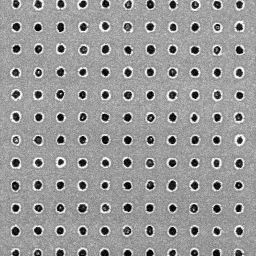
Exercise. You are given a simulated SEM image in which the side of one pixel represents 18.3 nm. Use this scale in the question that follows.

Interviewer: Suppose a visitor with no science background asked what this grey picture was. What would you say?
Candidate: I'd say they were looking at a regular array of holes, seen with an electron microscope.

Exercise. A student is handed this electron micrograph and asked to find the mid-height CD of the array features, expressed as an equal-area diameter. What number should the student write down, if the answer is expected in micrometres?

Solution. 0.157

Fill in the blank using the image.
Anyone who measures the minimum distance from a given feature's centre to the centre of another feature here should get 403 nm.